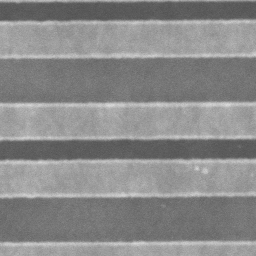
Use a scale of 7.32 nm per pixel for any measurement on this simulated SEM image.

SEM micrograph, lines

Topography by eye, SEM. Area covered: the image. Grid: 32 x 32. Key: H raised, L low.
LLLLLLLLLLLLLLLLLLLLLLLLLLLLLLLL
LLLLLLLLLLLLLLLLLLLLLLLLLLLLLLLL
LLLLLLLLLLLLLLLLLLHLLLLLLHLHLHHH
HHHHHHHHHHHHHHHHHHHHHHHHHHHHHHHH
HHHHHHHHHHHHHHHHHHHHHHHHHHHHHHHH
HHHHHHHHHHHHHHHHHHHHHHHHHHHHHHHH
HHHHHHHHHHHHHHHHHHHHHHHHHHHHHHHH
LLLLLLLLLLLLLLLLLLLLLLLLLLLLLLLL
LLLLLLLLLLLLLLLLLLLLLLLLLLLLLLLL
LLLLLLLLLLLLLLLLLLLLLLLLLLLLLLLL
LLLLLLLLLLLLLLLLLLLLLLLLLLLLLLLL
LLLLLLLLLLLLLLLLLLLLLLLLLLLLLLLL
LLLLLLLLLLLLLLLLLLLLLLLLLLLLLLLL
HHHHHHHHHHHHHHHHHHHHHHHHHHHHHHHH
HHHHHHHHHHHHHHHHHHHHHHHHHHHHHHHH
HHHHHHHHHHHHHHHHHHHHHHHHHHHHHHHH
HHHHHHHHHHHHHHHHHHHHHHHHHHHHHHHH
HHLLLLLLLLLLLLLLLLLLLLLLLLLLLLLL
LLLLLLLLLLLLLLLLLLLLLLLLLLLLLLLL
LLLLLLLLLLLLLLLLLLLLLLLLLLLLLLLL
HHHHHHHHHHHHHHHHHHHHHHHHHHHHHHHH
HHHHHHHHHHHHHHHHHHHHHHHHHHHHHHHH
HHHHHHHHHHHHHHHHHHHHHHHHHHHHHHHH
HHHHHHHHHHHHHHHHHHHHHHHHHHHHHHHH
HHHHHHHHHHHHHHHHHHHHHHLLLLLLLLLL
LLLLLLLLLLLLLLLLLLLLLLLLLLLLLLLL
LLLLLLLLLLLLLLLLLLLLLLLLLLLLLLLL
LLLLLLLLLLLLLLLLLLLLLLLLLLLLLLLL
LLLLLLLLLLLLLLLLLLLLLLLLLLLLLLLL
LLLLLLLLLLLLLLLLLLLLLLLLLLLLLLLL
HHHHHHHHHHHHHHHHHHHHHHHHHHHHHHHH
HHHHHHHHHHHHHHHHHHHHHHHHHHHHHHHH